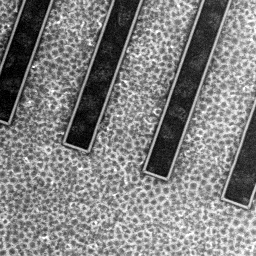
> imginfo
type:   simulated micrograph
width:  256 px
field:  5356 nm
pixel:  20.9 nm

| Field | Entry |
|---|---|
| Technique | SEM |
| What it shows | one or a few lines or trenches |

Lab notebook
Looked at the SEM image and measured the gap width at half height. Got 57.6 px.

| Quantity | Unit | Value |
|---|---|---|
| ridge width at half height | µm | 0.543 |